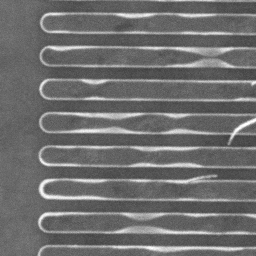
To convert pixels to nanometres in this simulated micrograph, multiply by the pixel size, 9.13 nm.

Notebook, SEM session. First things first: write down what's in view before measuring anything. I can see groups of lines, slits or small figures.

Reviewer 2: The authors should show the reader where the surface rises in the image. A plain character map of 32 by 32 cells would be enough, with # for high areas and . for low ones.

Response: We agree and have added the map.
................................
................................
.....###########################
.....###########################
................................
................................
.....###########################
.....###########################
................................
................................
.....###########################
.....###########################
....................##########..
................................
.....###########################
.....###########################
................######..########
................................
.....############...............
.....###########################
......##########################
................................
.......###..............#.......
.....###########################
......##########################
................................
................................
.....###########################
.....###########################
................................
................................
.....###########################